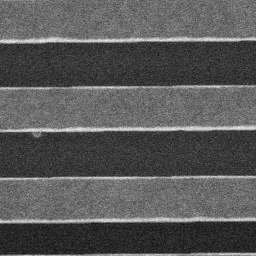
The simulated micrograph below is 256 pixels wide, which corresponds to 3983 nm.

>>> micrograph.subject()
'lines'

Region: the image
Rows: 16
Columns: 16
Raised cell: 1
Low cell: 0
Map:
1111111111111111
1111111111111111
1111111111111110
0000000000000000
0000000000000000
0000011111111111
1111111111111111
1111111111111111
0000000000000000
0000000000000000
0000000000000000
1111111111111111
1111111111111111
1111111111111111
0000000000000000
0000000000000000